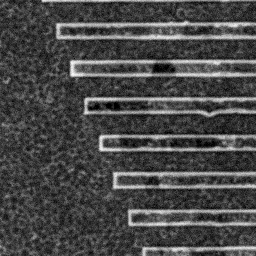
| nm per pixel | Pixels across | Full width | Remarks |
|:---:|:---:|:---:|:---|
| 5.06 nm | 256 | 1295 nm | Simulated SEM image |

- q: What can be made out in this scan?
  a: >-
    parallel lines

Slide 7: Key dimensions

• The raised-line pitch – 189 nm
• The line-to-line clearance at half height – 119 nanometers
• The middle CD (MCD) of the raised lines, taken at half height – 70.2 nm